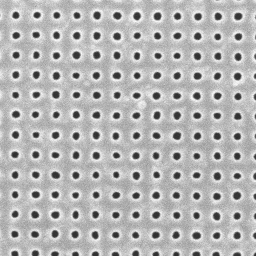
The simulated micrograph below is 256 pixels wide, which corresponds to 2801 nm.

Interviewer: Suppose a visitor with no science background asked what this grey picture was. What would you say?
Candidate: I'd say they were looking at a regular array of holes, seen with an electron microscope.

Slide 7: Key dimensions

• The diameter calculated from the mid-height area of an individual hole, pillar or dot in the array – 81.9 nm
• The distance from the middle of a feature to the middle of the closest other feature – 215 nm